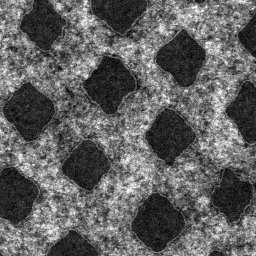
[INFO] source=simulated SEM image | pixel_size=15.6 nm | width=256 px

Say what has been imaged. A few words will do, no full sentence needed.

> raised bodies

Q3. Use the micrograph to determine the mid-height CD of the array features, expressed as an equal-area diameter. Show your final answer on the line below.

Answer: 768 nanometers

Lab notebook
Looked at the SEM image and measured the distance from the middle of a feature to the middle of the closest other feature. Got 1.23 um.